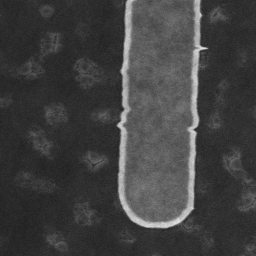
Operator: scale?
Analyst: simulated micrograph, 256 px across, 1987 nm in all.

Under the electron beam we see one or a few lines or trenches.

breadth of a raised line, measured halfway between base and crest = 70.4 pixels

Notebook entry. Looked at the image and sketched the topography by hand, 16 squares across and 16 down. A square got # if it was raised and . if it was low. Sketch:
........####....
........####....
........####....
........####....
........####....
........####....
........####....
........####....
........####....
........####....
........####....
........####....
........####....
........###.....
................
................